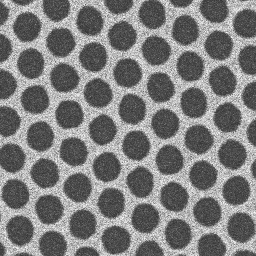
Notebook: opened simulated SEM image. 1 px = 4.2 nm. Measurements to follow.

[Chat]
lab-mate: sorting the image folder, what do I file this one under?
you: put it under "a regular array of holes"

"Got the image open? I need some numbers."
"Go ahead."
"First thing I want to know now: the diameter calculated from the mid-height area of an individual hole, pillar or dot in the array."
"0.122 um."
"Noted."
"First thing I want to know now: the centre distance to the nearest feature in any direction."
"150 nm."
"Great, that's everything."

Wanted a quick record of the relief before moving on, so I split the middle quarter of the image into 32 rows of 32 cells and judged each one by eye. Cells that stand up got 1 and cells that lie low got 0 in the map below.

00111000001110000001111111110000
00011100001110000001111111110000
00011111111100000001110000111000
00001111111110000001100000111000
00001100001110000001100000011111
00011000000111000011100000001111
00111000000011111111100000001110
11111000000011110111100000001000
11111000000011100001110000011000
00011100000011000000111001111000
00001110001111000000111111111000
00000111111110000000111100011100
00000111101111000000011000001100
00000111000011000000110000000111
00000110000011100001110000000111
00001100000001111111110000000111
11111100000001111111110000000110
11111100000001110000111000001100
10011110000001100000011100011100
00000110000011100000011111111100
00000011111111000000001110001100
00000011111111100000011100000110
00000011100011100000011000000011
00000011000001110000111000000011
00000110000000111111111000000011
10011110000000111111111000000011
11111110000000111000011100000110
11000111000000110000001110001110
10000011000001110000001111111110
00000001110111100000001111101111
00000001111111110000001110000011
00000001110000110000001100000001